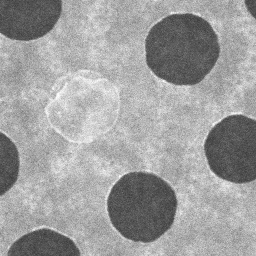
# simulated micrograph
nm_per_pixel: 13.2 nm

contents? holes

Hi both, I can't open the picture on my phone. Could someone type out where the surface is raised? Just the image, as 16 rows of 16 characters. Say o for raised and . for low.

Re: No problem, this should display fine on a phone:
....ooooooooooo.
...ooooooo...ooo
o.ooooooo.....oo
ooooooooo.....oo
oooooooooo...ooo
oooooooooooooooo
oooooooooooooooo
oooooooooooooo..
ooooooooooooo...
.oooooooooooo...
.oooooooooooo...
.oooooo....ooooo
ooooooo....ooooo
ooooooo....ooooo
oo..ooo...oooooo
o....ooooooooooo